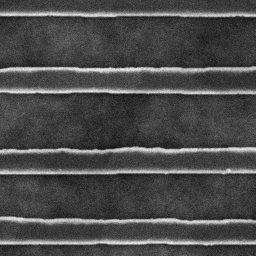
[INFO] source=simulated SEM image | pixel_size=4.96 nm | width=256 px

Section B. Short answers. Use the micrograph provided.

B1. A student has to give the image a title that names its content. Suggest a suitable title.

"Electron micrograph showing lines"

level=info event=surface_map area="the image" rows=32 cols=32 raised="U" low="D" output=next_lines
UUUUUUUUUUUUUUUUUUUUUUUUUUUUUUUU
UUUUUUUUUUUUUUUUUUUUUUUUUUUUUUUU
DDDDDDDDDDDDDDDDDDDDDDDDDDDDDDDD
DDDDDDDDDDDDDDDDDDDDDDDDDDDDDDDD
DDDDDDDDDDDDDDDDDDDDDDDDDDDDDDDD
DDDDDDDDDDDDDDDDDDDDDDDDDDDDDDDD
DDDDDDDDDDDDDDDDDDDDDDDDDDDDDDDD
DDDDDDDDDDDDDDDDDDDDDDDDDDDDDDDD
DDDDUUUUUDDDDDDDDDDDDDDDDDUUUDDU
UUUUUUUUUUUUUUUUUUUUUUUUUUUUUUUU
UUUUUUUUUUUUUUUUUUUUUUUUUUUUUUUU
DDDDDUUUDDDDDDUUUUUUUUUUUUUUUUUU
DDDDDDDDDDDDDDDDDDDDDDDDDDDDDDDD
DDDDDDDDDDDDDDDDDDDDDDDDDDDDDDDD
DDDDDDDDDDDDDDDDDDDDDDDDDDDDDDDD
DDDDDDDDDDDDDDDDDDDDDDDDDDDDDDDD
DDDDDDDDDDDDDDDDDDDDDDDDDDDDDDDD
DDDDDDDDDDDDDDDDDDDDDDDDDDDDDDDD
DDDDDDDDDDDDDDDDUUDDDDDDDDDDDDDD
UUUUUUUUUUUUUUUUUUUUUUUUUUUUUUUU
UUUUUUUUUUUUUUUUUUUUUUUUUUUUUUUU
UUUUUUUUUUUUUUUUUDUUUUUUUUUUUUDU
DDDDDDDDDDDDDDDDDDDDDDDDDDDDDDDD
DDDDDDDDDDDDDDDDDDDDDDDDDDDDDDDD
DDDDDDDDDDDDDDDDDDDDDDDDDDDDDDDD
DDDDDDDDDDDDDDDDDDDDDDDDDDDDDDDD
DDDDDDDDDDDDDDDDDDDDDDDDDDDDDDDD
UUUUUUUUUUUDDDDDUUUUUUUDDDDDDUDD
UUUUUUUUUUUUUUUUUUUUUUUUUUUUUUUU
UUUUUUUUUUUUUUUUUUUUUUUUUUUUUUUU
DDDDDDDDDDDDDDDDDDDDDDDDDDDDDDDD
DDDDDDDDDDDDDDDDDDDDDDDDDDDDDDDD